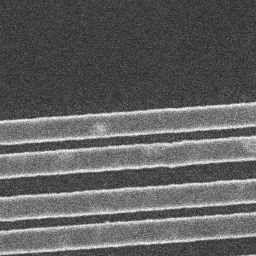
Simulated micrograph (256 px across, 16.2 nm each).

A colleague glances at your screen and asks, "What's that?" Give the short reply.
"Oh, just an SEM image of parallel lines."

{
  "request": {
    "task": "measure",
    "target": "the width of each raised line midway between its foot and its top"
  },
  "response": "23.2 pixels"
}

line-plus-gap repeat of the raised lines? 36.5 px